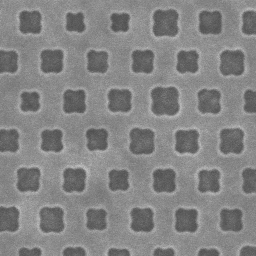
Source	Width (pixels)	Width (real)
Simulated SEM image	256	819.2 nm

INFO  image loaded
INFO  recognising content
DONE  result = a regular array of holes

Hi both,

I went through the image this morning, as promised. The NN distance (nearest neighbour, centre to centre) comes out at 143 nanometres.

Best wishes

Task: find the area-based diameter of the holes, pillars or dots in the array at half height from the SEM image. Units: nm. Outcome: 85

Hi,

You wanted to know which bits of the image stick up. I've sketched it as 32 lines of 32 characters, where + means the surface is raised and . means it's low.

++++++++++++++++++++++++++++++++
+++..++++++++++++++...+++..++++.
++...+++...+++..+++...+++...++..
++...+++...+++..+++...+++...++..
++++++++++++++++++++..++++++++++
++++++++++++++++++++++++++++++++
..+++...+++..++++..+++...+++..++
..+++...+++...++...+++...++....+
..+++...+++...++...+++...++....+
++++++++++++++++++++++++++++..++
++++++++++++++++++++++++++++++++
+++..+++...++...+++...+++..++++.
++...+++...++...+++...+++...++..
++...+++...++...+++...+++...++..
+++++++++++++++++++++.++++++++++
++++++++++++++++++++++++++++++++
..+++...+++..+++...+++...++...++
..+++...+++..+++...+++...++....+
..+++...+++..+++...+++...++....+
++++++++++++++++++++++++++++++++
++++++++++++++++++++++++++++++++
++...+++...+++..+++...+++...++..
++...+++...+++..+++...+++...++..
++...+++...+++..+++...+++...++..
++++++++++++++++++++++++++++++++
++++++++++++++++++++++++++++++++
..+++...+++..+++...+++...+++..++
..+++...+++..+++...+++...++...++
..+++...+++..+++...+++...+++..++
++++++++++++++++++++++++++++++++
++++++++++++++++++++++++++++++++
++...+++...++...+++...+++..+++..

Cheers